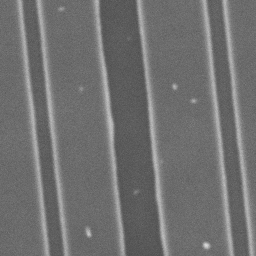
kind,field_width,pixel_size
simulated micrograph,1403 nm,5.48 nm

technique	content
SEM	lines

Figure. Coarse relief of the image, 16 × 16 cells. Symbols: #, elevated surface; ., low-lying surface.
######...#######
######...#######
######...#######
######...#######
#######..#######
#######..#######
#######..#######
#######..#######
#######...######
#######...######
#######...######
#######...######
#######...######
########..######
########..######
########..######